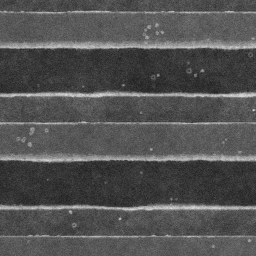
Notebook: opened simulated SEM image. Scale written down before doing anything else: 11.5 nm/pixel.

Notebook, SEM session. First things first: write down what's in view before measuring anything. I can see lines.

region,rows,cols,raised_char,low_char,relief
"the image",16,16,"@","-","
@@@@@@@@@@@@@@@@
@@@@@@@@@@@@@@@@
@@@@@@@@@@@@@@@@
----------------
----------------
----------------
@@@@@@@@@@@@@@@@
@@@@@@@@@@@@@@@@
@@@@@@@@@@@@@@@@
@@@@@@@@@@@@@@@@
----------------
----------------
----------------
@@@@@@@@@@@@@@@@
@@@@@@@@@@@@@@@@
@@@@@@@@@@@@@@@@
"